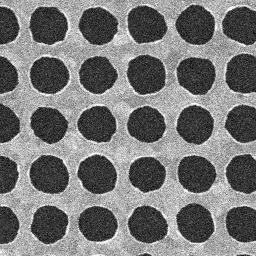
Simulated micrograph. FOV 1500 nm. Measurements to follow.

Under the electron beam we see a regular array of holes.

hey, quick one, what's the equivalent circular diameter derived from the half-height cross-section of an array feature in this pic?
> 0.231 microns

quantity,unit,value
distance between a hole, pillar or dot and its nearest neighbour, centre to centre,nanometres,284